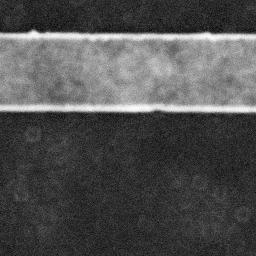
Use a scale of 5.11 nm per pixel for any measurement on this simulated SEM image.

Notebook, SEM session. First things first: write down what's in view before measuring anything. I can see one or a few lines or trenches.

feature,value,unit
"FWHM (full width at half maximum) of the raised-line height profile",372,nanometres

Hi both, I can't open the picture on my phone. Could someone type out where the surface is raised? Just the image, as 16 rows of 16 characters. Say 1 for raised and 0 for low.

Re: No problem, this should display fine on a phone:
0000000000000000
0000000000000000
1111111111111111
1111111111111111
1111111111111111
1111111111111111
1111111111111111
0000000000000000
0000000000000000
0000000000000000
0000000000000000
0000000000000000
0000000000000000
0000000000000000
0000000000000000
0000000000000000